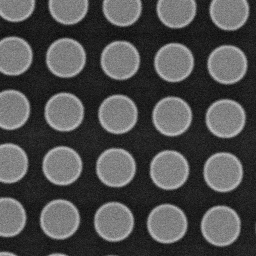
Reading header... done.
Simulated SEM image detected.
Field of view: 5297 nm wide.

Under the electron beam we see an array of small figures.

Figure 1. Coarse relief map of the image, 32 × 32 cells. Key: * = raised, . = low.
****..*****..*****..****..*****.
****..*****..*****..****..*****.
.**....***....***...****...****.
............................**..
................................
***....***....**................
****..*****..****...****...***..
****..*****..****..*****..*****.
***...****...****..*****..*****.
.......**.....**....***....***..
................................
**..............................
***...****...***....***.....*...
****..****...****..*****..****..
***...****..*****..*****..*****.
***...****...****..*****..*****.
..............**....***....***..
................................
**.....*........................
***...****...***....***....**...
***..*****..*****..****...****..
***...****..*****..****...****..
**....***....***...****...****..
....................**.....**...
................................
**....***....**.................
***..*****..****...****...***...
***..*****..*****..****..*****..
***..*****..*****.*****..*****..
*.....***....***...****...****..
...........................**...
................................